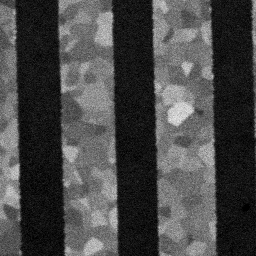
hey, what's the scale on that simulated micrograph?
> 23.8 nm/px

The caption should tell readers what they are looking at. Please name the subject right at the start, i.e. one or a few lines or trenches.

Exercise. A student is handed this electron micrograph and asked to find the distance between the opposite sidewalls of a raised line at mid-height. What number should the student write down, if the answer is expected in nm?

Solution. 1300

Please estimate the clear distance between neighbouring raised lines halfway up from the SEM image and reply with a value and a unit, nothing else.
1000 nm